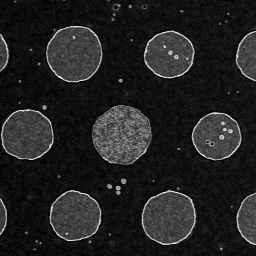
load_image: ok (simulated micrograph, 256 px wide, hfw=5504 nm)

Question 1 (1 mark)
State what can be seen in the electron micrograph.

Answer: raised bodies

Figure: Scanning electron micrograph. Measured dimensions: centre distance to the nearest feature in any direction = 2.01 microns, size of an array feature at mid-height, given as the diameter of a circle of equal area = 1110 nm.